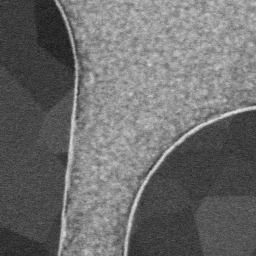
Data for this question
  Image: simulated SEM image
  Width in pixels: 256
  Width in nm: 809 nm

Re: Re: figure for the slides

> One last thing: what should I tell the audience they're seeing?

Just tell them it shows one or a few lines or trenches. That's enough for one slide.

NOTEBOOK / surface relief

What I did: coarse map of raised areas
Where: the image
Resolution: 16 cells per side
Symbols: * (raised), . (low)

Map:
****............
****............
*****...........
*****...........
*****...........
*****...........
*****...........
*****........***
****........****
****......******
****......******
****.....*******
****.....*******
****....********
****....********
****....********